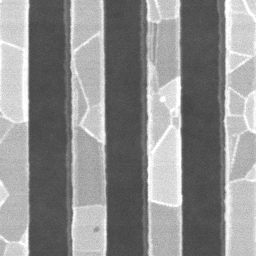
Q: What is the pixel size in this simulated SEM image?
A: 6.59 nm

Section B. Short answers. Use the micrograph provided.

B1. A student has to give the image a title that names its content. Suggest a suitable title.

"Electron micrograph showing lines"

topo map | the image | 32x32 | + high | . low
++++.....++++.....++++......++++
++++.....++++.....++++......++++
+++......++++.....++++......++++
+++......++++.....++++......++++
+++......++++.....++++......++++
+++......++++.....++++......++++
+++......++++.....++++......++++
+++......++++.....++++......++++
+++......++++.....++++......++++
+++......++++.....++++......++++
+++......++++.....+++++.....++++
+++......++++.....+++++.....++++
++++.....++++.....++++......++++
+++......++++.....++++......++++
+++......++++.....+++++.....++++
+++......++++.....+++++.....++++
+++......++++.....+++++.....++++
+++......++++.....+++++.....++++
+++......++++.....+++++.....++++
+++......++++.....+++++.....++++
++++.....++++......++++.....++++
++++.....++++.....+++++.....++++
++++.....++++.....+++++.....++++
++++.....++++......++++.....++++
+++......++++......++++.....++++
++++.....++++.....+++++.....++++
++++.....++++......++++.....++++
++++.....++++......++++.....++++
+++......++++......++++.....++++
+++......++++......++++.....++++
+++......++++......++++.....++++
++++.....++++......++++.....++++